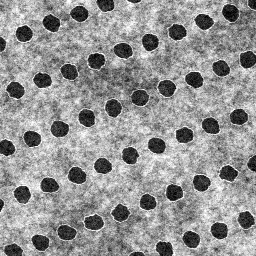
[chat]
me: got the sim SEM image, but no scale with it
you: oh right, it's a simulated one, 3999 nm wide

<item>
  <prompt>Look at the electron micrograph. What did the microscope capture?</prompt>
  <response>a regular array of raised bodies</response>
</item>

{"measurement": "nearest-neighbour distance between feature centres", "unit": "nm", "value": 443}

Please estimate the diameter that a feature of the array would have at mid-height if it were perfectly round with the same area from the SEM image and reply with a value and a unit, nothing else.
0.286 micrometres